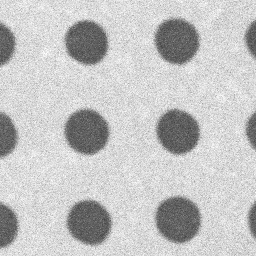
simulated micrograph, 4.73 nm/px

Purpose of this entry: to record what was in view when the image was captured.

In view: holes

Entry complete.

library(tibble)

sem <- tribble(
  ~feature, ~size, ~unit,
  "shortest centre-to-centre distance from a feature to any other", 423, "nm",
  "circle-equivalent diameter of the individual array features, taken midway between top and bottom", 208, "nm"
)